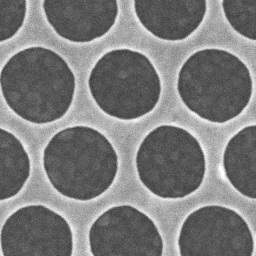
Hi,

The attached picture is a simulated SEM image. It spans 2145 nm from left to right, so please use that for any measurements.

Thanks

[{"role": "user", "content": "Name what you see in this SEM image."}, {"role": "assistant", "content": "holes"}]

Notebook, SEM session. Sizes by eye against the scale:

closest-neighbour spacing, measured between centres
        89.5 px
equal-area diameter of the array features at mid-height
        610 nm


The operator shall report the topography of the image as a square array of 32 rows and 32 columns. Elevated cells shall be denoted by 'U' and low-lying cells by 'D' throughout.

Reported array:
DDDUUDDDDDDDDDDUUDDDDDDDDDUUDDDD
DDDUUUDDDDDDDDDUUDDDDDDDDDUUDDDD
DDDUUUDDDDDDDDUUUDDDDDDDDUUUDDDD
DDDUUUUDDDDDDDUUUUDDDDDDDUUUUDDD
DDUUUUUUDDDDDUUUUUUDDDDDUUUUUUDD
UUUUUUUUUUUUUUUUUUUUUUUUUUUUUUUU
UUDDDDDUUUUUUDDDDUUUUUUUUDDDDUUU
UDDDDDDDUUUUDDDDDDDUUUUDDDDDDDUU
DDDDDDDDDUUUDDDDDDDUUUUDDDDDDDDU
DDDDDDDDDUUDDDDDDDDDUUDDDDDDDDDU
DDDDDDDDDUUDDDDDDDDDUUDDDDDDDDDD
DDDDDDDDDUUDDDDDDDDDUUDDDDDDDDDU
UDDDDDDDDUUUDDDDDDDDUUUDDDDDDDDU
UDDDDDDDDUUUDDDDDDDUUUUDDDDDDDDU
UUDDDDDDUUUUUUDDDDUUUUUUUDDDDDUU
UUUUUUUUUUUUUUUUUUUUUUUUUUUUUUUU
DUUUUUUDDDDDUUUUUUUDDDDDUUUUUUDD
DDUUUUDDDDDDDDUUUUDDDDDDDUUUUDDD
DDDUUUDDDDDDDDUUUDDDDDDDDUUUDDDD
DDDDUDDDDDDDDDDUUDDDDDDDDDUUDDDD
DDDDUDDDDDDDDDDUUDDDDDDDDDUUDDDD
DDDDUUDDDDDDDDDUUDDDDDDDDDUUDDDD
DDDUUUDDDDDDDDUUUUDDDDDDDUUUUDDD
DDDUUUUDDDDDDDUUUUDDDDDDDUUUUDDD
DDUUUUUUDDDDUUUUUUUUDDDUUUUUUUUD
UUUUUUUUUUUUUUUUUUUUUUUUUUUUUUUU
UUDDDDDUUUUUUDDDDDUUUUUUDDDDDUUU
UDDDDDDDUUUUDDDDDDDUUUUDDDDDDDDU
DDDDDDDDDUUDDDDDDDDDUUUDDDDDDDDU
DDDDDDDDDUUDDDDDDDDDUUDDDDDDDDDD
DDDDDDDDDUUDDDDDDDDDUUDDDDDDDDDD
DDDDDDDDDUUDDDDDDDDDUUDDDDDDDDDD